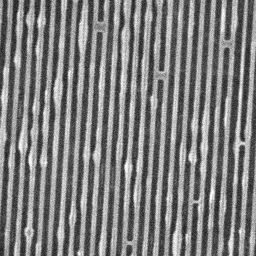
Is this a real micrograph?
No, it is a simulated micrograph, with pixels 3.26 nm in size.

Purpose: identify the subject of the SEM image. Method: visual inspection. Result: parallel lines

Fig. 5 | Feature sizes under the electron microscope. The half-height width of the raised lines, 14.6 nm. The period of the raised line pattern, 0.0347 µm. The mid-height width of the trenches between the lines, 0.0208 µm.